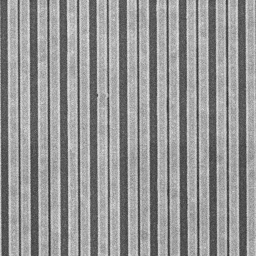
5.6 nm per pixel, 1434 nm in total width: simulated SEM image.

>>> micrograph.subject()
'parallel lines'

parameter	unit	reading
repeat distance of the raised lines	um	0.0827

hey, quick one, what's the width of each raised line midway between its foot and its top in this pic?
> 48.3 nm